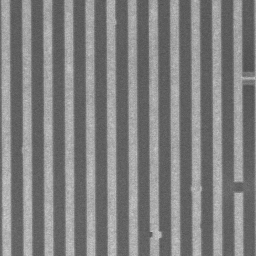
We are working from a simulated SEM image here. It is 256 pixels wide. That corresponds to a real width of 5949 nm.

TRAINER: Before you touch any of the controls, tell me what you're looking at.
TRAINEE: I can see parallel lines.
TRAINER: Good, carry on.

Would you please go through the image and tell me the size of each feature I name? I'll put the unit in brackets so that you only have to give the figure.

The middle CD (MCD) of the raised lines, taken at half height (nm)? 212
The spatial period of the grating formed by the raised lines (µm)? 0.49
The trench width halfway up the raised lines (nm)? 288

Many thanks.